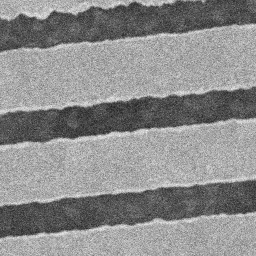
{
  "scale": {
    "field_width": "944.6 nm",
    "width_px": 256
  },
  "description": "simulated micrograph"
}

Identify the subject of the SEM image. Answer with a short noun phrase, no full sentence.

one or a few lines or trenches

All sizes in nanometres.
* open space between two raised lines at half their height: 127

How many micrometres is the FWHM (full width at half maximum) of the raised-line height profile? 0.215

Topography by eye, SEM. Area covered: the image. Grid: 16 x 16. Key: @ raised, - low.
@@@@@-----------
----------------
-------@@@@@@@@@
@@@@@@@@@@@@@@@@
@@@@@@@@@@@@@@@@
@@@@@@@@@@@@@@@-
@@@@@-----------
----------------
-------@@@@@@@@@
@@@@@@@@@@@@@@@@
@@@@@@@@@@@@@@@@
@@@@@@@@@@@@----
@@@-------------
-------------@@@
----@@@@@@@@@@@@
@@@@@@@@@@@@@@@@